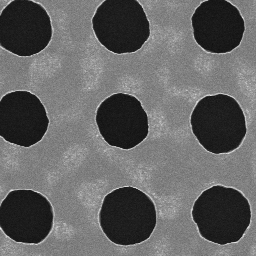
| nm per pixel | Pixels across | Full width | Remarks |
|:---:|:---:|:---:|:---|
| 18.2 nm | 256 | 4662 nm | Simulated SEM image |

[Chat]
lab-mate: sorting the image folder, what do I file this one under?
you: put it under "holes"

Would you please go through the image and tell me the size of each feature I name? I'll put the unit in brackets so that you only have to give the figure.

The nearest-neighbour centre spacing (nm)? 1690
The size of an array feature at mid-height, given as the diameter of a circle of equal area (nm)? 1050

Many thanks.